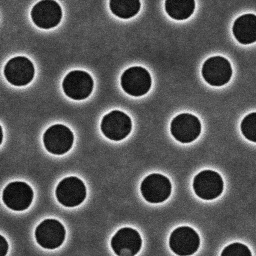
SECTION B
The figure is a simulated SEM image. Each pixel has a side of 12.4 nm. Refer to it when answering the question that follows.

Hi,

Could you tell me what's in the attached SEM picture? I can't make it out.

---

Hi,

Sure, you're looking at a regular array of holes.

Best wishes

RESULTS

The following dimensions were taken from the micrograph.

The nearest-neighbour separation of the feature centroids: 649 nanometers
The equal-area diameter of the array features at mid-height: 0.385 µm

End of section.